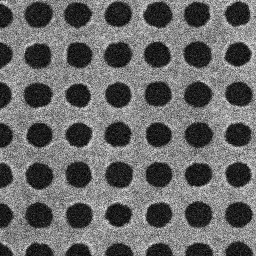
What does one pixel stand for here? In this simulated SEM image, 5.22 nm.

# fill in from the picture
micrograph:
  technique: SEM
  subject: a regular array of holes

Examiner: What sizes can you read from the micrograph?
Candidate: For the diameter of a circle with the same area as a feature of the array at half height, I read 138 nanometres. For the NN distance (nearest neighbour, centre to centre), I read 0.206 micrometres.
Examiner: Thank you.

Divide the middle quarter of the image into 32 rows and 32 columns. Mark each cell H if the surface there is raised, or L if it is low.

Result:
HHLLLLHHHHHLLLLHHHHHHHLLLHHHHHHH
HHHHHHHHHHHHHHHHHHHHHHHHHHHHHHHH
HHHHHHHHHHHHHHHHHHHHHHHHHHHHHHHH
HHHHHHHHHHHHHHHHHHHHHHHHHHHHHHHH
HHHHHHHHHHHHHHHHHHHHHHLLLHHHHHHH
HHLLLLHHHHHLLLLLHHHHHLLLLLHHHHHL
HLLLLLHHHHLLLLLLLHHHLLLLLLLHHHLL
LLLLLLLHHHLLLLLLLHHHLLLLLLLHHHLL
LLLLLLLHHHLLLLLLLHHHLLLLLLLHHHLL
HLLLLLHHHHHLLLLLHHHHHLLLLLHHHHLL
HHLLLLHHHHHHLLLHHHHHHHLLLHHHHHHH
HHHHHHHHHHHHHHHHHHHHHHHHHHHHHHHH
HHHHHHHHHHHHHHHHHHHHHHHHHHHHHHHH
HHHHHHHHHHHHHHHHHHHHHHHHHHHHHHHH
HHHHHHHHHHHHHLHHHHHHHHHLHHHHHHHH
HLLLLLHHHHHLLLLLHHHHHLLLLLHHHHHL
HLLLLLLHHHLLLLLLLHHHLLLLLLLHHHLL
LLLLLLLHHHLLLLLLLHHHLLLLLLLHHHLL
LLLLLLLHHHLLLLLLLHHHLLLLLLLHHHLL
HLLLLLHHHHHLLLLLHHHHHLLLLLHHHHHL
HHLLLHHHHHHHLLLHHHHHHHLLLHHHHHHH
HHHHHHHHHHHHHHHHHHHHHHHHHHHHHHHH
HHHHHHHHHHHHHHHHHHHHHHHHHHHHHHHH
HHHHHHHHHHHHHHHHHHHHHHHHHHHHHHHH
HHHLLHHHHHHHHLHHHHHHHHLLHHHHHHHH
HLLLLLHHHHHLLLLLLHHHHLLLLLHHHHHL
HLLLLLLHHHHLLLLLLHHHHLLLLLLHHHLL
HLLLLLLHHHLLLLLLLHHHLLLLLLLHHHLL
HLLLLLLHHHLLLLLLLHHHHLLLLLLHHHLL
HLLLLLHHHHHLLLLLLHHHHLLLLLHHHHHL
HHLLLHHHHHHHLLLLHHHHHHLLLHHHHHHH
HHHHHHHHHHHHHHHHHHHHHHHHHHHHHHHH